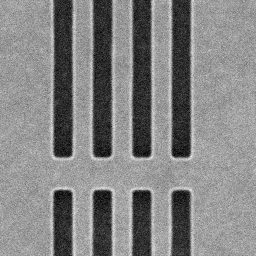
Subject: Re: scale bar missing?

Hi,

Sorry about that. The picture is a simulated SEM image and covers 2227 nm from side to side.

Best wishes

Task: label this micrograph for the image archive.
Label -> groups of lines, slits or small figures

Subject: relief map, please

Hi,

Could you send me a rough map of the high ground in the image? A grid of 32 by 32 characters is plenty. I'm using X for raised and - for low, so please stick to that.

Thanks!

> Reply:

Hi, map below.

XXXXXX---XX---XX---XX---XXXXXXXX
XXXXXX---XX---XX---XX---XXXXXXXX
XXXXXX---XX---XX---XX---XXXXXXXX
XXXXXXX--XXX--XX---XX---XXXXXXXX
XXXXXXX--XXX--XX---XX---XXXXXXXX
XXXXXXX--XXX--XX---XX---XXXXXXXX
XXXXXXX--XXX--XX---XX---XXXXXXXX
XXXXXXX--XX---XX---XX---XXXXXXXX
XXXXXXX--XX---XX---XX---XXXXXXXX
XXXXXXX--XX---XX---XX---XXXXXXXX
XXXXXX---XX---XX---XX---XXXXXXXX
XXXXXX---XX---XX---XX---XXXXXXXX
XXXXXX---XX---XX---XX---XXXXXXXX
XXXXXX---XX---XX---XX---XXXXXXXX
XXXXXX---XX---XX---XX---XXXXXXXX
XXXXXX---XX---XX---XX---XXXXXXXX
XXXXXX---XX---XX---XX---XXXXXXXX
XXXXXX---XX---XX---XX---XXXXXXXX
XXXXXX---XX---XX---XX---XXXXXXXX
XXXXXXX--XXX--XXX--XXX--XXXXXXXX
XXXXXXXXXXXXXXXXXXXXXXXXXXXXXXXX
XXXXXXXXXXXXXXXXXXXXXXXXXXXXXXXX
XXXXXXXXXXXXXXXXXXXXXXXXXXXXXXXX
XXXXXXXXXXXXXXXXXXXXXXXXXXXXXXXX
XXXXXX---XX---XX---XX---XXXXXXXX
XXXXXX---XX---XX---XX---XXXXXXXX
XXXXXX---XX---XX---XX---XXXXXXXX
XXXXXX---XX---XX---XX---XXXXXXXX
XXXXXX---XX---XX---XX---XXXXXXXX
XXXXXX---XX---XX---XX---XXXXXXXX
XXXXXX---XX---XX---XX---XXXXXXXX
XXXXXX---XX---XX---XX---XXXXXXXX